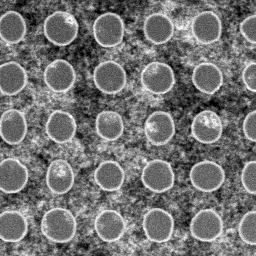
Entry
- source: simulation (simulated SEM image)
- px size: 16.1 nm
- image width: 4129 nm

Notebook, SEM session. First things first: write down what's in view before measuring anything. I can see a regular array of raised bodies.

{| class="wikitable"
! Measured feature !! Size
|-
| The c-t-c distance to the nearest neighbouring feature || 779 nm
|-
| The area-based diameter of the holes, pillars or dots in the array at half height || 0.477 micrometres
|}